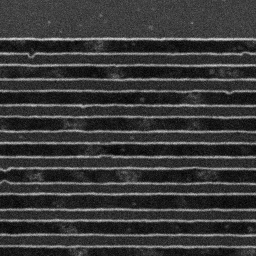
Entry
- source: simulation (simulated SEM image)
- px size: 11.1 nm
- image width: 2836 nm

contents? parallel lines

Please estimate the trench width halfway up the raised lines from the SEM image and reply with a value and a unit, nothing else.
123 nm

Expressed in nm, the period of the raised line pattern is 287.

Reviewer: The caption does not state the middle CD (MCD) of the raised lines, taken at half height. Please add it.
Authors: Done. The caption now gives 162 nm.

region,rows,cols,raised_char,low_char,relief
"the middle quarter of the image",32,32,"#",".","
##############################.#
################################
################################
################################
................................
................................
................................
################################
################################
################################
....##..........................
................................
................................
################################
################################
################################
################################
................................
................................
................................
################################
################################
################################
................................
................................
................................
################################
################################
################################
################################
................................
................................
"